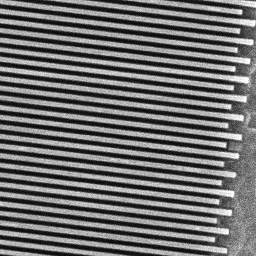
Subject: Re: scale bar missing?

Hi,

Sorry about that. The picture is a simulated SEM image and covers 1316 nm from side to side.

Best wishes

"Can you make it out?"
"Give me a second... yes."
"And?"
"parallel lines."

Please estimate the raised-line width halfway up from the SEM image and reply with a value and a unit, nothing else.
24.9 nanometres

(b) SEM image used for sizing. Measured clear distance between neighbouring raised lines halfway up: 24.9 nanometres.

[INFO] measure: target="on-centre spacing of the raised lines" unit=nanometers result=49.1